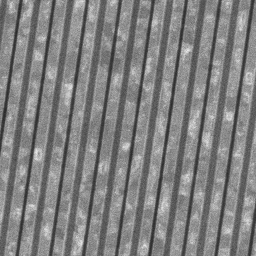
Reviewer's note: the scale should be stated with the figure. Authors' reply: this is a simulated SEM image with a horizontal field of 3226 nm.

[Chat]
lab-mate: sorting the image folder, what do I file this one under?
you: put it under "parallel lines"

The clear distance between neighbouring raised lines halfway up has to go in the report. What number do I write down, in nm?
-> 87.4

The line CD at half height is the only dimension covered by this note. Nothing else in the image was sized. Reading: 144 nanometers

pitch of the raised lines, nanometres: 206